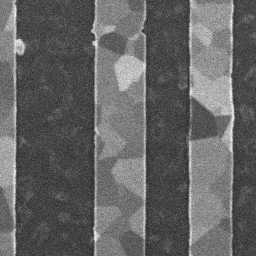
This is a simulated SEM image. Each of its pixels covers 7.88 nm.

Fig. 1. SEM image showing one or a few lines or trenches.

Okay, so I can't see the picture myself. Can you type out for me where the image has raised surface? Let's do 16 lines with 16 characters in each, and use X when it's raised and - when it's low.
X-----XXX---XXX-
X-----XXX---XX--
X-----XXX---XX--
X-----XXX---XX--
X-----XXX---XX--
X-----XXX---XX--
X-----XXX---XXX-
X-----XXX---XXX-
X-----XXX---XXX-
X-----XXX---XXX-
X-----XXX---XXX-
X-----XXX---XXX-
X-----XXX---XXX-
X-----XXX---XX--
X-----XXX---XX--
X-----XXX---XX--